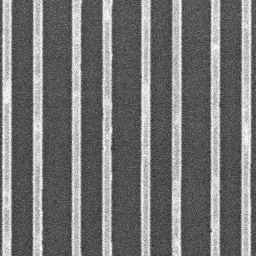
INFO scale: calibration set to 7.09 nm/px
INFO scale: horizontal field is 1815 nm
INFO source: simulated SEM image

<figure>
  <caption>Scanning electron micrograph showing parallel lines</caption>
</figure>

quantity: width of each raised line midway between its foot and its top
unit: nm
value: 47.8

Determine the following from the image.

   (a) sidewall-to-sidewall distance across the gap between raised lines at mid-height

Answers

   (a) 168 nm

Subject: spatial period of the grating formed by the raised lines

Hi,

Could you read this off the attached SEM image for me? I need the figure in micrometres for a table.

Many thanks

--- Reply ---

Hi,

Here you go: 0.242